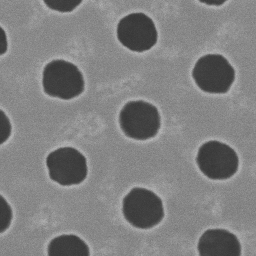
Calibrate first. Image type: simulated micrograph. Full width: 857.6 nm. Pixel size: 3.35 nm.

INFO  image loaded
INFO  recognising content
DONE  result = holes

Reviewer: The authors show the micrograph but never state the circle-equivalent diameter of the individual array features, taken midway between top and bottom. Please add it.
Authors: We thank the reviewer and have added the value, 0.132 um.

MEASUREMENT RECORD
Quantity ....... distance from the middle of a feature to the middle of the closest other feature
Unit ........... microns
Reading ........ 0.289